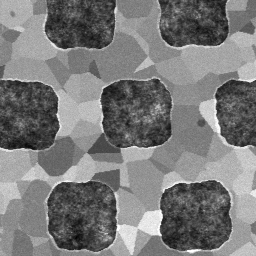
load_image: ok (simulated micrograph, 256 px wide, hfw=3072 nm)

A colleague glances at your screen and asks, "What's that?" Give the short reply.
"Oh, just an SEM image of holes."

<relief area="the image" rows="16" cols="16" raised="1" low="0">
1110000111000011
1110000111000011
1110000111000011
1111111111111111
1111111111111111
0001111000111100
0000110000011000
0000110000011100
0000111000011100
1111111111111111
1111111111111111
1111001111100011
1110000111000011
1110000111000011
1110000111000011
1111000111100111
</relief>